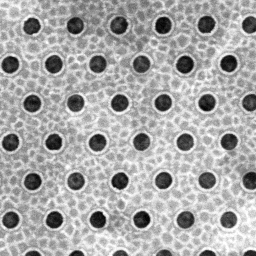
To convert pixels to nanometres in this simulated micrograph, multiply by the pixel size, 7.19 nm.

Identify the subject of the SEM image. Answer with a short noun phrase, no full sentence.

a regular array of holes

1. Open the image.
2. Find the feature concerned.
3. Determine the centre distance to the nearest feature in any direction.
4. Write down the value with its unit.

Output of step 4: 43.4 px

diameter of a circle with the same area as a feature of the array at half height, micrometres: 0.13